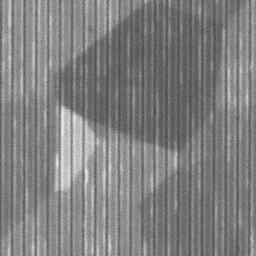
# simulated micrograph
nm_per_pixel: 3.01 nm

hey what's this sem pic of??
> parallel lines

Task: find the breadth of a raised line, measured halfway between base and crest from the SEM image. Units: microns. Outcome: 0.026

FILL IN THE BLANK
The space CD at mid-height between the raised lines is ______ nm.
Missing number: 10.9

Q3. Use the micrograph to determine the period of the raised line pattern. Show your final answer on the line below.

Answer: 0.0357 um